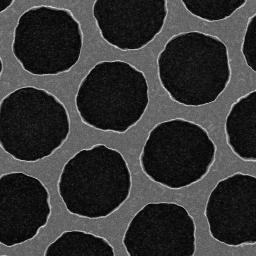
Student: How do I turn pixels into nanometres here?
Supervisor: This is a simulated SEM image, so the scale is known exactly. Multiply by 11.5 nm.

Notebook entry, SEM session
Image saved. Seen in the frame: holes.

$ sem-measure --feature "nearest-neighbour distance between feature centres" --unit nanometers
991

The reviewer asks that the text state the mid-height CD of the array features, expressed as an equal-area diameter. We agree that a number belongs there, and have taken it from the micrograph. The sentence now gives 810 nm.